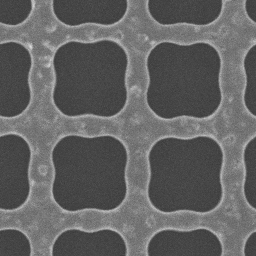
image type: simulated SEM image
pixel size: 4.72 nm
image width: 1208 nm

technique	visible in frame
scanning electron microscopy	holes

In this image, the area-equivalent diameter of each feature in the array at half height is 380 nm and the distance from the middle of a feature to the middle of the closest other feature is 0.443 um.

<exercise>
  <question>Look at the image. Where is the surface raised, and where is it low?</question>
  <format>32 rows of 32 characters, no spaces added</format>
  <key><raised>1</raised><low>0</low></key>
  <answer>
00001110000000001100000000001110
00001110000000001110000000001110
00011110000000011110000000011111
11111111111111111111111111111111
11111111111111111111111111111111
00011111000000011111001100111111
00001110000000001110000000011110
00001110000000001100000000001100
00001110000000001100000000001100
00001110000000001110000000011110
00001110000000001110000000011110
00001110000000001100000000001110
00001110000000001100000000001110
00011110000000011110000000011110
00111111001100111111000000111111
11111111111111111111111111111111
11111111111111111111111111111111
00011111000000011111000000011110
00001110000000001110000000001110
00001100000000001110000000001100
00001110000000001110000000001110
00001110000000001110000000001110
00001110000000001110000000001110
00001110000000001100000000001110
00001110000000001110000000001110
00011110000000011110000000011110
11111111111111111111001110111111
11111111111111111111111111111111
11111111111111111111111111111111
00011110000000011110000000011110
00001110000000001110000000001110
00001100000000001100000000001100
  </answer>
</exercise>